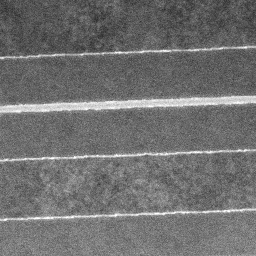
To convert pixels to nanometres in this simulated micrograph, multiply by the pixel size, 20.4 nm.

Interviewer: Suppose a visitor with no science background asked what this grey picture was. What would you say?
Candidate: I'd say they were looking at lines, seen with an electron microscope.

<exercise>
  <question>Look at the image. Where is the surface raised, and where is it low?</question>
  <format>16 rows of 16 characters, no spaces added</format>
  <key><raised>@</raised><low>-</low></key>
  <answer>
@@@@@@@@@@@@@@@@
@@@@@@@@@@@@@@@@
@@@@@@@@@@@@@@@@
@@@-------------
----------------
----------------
----------------
----------------
----------------
-------------@@@
@@@@@@@@@@@@@@@@
@@@@@@@@@@@@@@@@
@@@@@@@@@@@@@@@@
@@@@@@----------
----------------
----------------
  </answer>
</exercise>